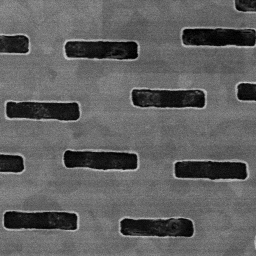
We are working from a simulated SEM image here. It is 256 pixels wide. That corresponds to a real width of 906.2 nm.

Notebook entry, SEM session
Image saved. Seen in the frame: holes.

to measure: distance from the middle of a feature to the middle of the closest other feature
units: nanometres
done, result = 276